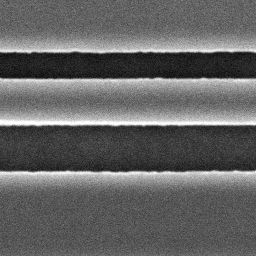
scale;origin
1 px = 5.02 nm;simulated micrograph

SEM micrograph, lines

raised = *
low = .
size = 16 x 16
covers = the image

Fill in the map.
****************
****************
****************
................
................
****************
****************
****************
................
................
................
****************
****************
****************
****************
****************